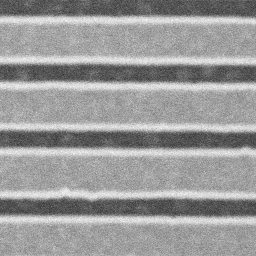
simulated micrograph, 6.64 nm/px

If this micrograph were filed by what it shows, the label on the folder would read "one or a few lines or trenches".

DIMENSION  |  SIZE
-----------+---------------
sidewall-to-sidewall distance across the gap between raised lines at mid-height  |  156 nm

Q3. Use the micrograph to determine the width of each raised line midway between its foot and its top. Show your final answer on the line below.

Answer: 286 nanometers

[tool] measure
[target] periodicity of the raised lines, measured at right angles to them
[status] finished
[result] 442 nm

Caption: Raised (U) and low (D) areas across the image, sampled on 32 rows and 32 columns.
DDDDDDDDDDDDDDDDDDDDDDDDDDDDDDDD
DDDDDDDDDDDDDDDDDDDDDDDDDDDDDDDD
UUUUUUUUUUUUUUUUUUUDDUUUUDDUUUDD
UUUUUUUUUUUUUUUUUUUUUUUUUUUUUUUU
UUUUUUUUUUUUUUUUUUUUUUUUUUUUUUUU
UUUUUUUUUUUUUUUUUUUUUUUUUUUUUUUU
UUUUUUUUUUUUUUUUUUUUUUUUUUUUUUUU
UUUUDUUUUDDUUUUUUUUUUUUUUUUUUUUU
DDDDDDDDDDDDDDDDDDDDDDDDDDDDDDDD
DDDDDDDDDDDDDDDDDDDDDDDDDDDDDDDD
DDDDDDDDDDDDDDDDDDDDDDDDDDDDDDDD
UUUUUUUUUUUUUUUUUUUUUUUUUUUUUUUU
UUUUUUUUUUUUUUUUUUUUUUUUUUUUUUUU
UUUUUUUUUUUUUUUUUUUUUUUUUUUUUUUU
UUUUUUUUUUUUUUUUUUUUUUUUUUUUUUUU
UUUUUUUUUUUUUUUUUUUUUUUUUUUUUUUU
DDDDDDDDDDDDDDDDDDDDDDDDDDDDDDDD
DDDDDDDDDDDDDDDDDDDDDDDDDDDDDDDD
DDDDDDDDDDDDDDDDDDDDDDDDDDDDDDDD
UUUUUUUUUUUUUUUUUUUUUUUUUUUUUUUU
UUUUUUUUUUUUUUUUUUUUUUUUUUUUUUUU
UUUUUUUUUUUUUUUUUUUUUUUUUUUUUUUU
UUUUUUUUUUUUUUUUUUUUUUUUUUUUUUUU
UUUUUUUUUUUUUUUUUUUUUUUUUUUUUUUU
DDDDUDDDDDDUDDDDDDDDDDDDDDDUUUUU
DDDDDDDDDDDDDDDDDDDDDDDDDDDDDDDD
DDDDDDDDDDDDDDDDDDDDDDDDDDDDDDDD
UUUUUUUUUUUUUUUUUUUUUDUDDDDDDDUU
UUUUUUUUUUUUUUUUUUUUUUUUUUUUUUUU
UUUUUUUUUUUUUUUUUUUUUUUUUUUUUUUU
UUUUUUUUUUUUUUUUUUUUUUUUUUUUUUUU
UUUUUUUUUUUUUUUUUUUUUUUUUUUUUUUU